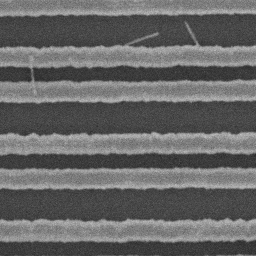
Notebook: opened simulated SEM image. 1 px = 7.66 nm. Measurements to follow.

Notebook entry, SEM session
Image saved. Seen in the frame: lines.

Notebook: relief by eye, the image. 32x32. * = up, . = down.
********************************
********************************
................................
................................
................................
................................
********************************
********************************
................................
................................
********************************
********************************
***************************.****
................................
................................
................................
................................
********************************
********************************
................................
................................
********************************
********************************
.........*......................
................................
................................
................................
................................
********************************
********************************
................................
................................